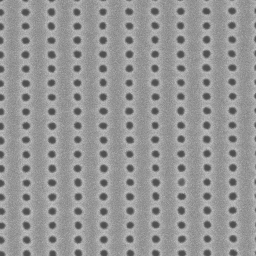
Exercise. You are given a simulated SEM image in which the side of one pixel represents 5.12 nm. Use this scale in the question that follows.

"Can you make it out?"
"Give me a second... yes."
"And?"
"a regular array of holes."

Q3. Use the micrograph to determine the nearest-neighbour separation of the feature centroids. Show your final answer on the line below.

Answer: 0.0714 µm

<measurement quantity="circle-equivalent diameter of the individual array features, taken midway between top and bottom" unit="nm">37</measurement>